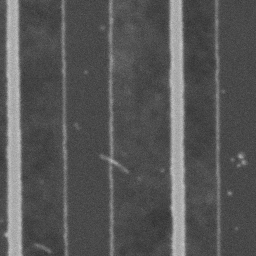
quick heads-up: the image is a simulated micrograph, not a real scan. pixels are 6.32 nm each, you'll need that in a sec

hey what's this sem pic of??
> lines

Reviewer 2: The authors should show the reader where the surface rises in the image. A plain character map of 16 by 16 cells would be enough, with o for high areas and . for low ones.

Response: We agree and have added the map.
....ooo.......oo
....ooo.......oo
....ooo.......oo
....ooo.......oo
....ooo.......oo
....ooo.......oo
....ooo.......oo
....ooo.......oo
....ooo.......oo
....ooo.......oo
....ooo.......oo
....ooo.......oo
....ooo.......oo
....ooo.......oo
....ooo.......oo
....ooo.......oo